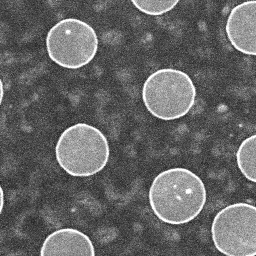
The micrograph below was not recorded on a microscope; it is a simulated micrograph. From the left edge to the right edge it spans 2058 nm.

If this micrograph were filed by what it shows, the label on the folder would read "raised bodies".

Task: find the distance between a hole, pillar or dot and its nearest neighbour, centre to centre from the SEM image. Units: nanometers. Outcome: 825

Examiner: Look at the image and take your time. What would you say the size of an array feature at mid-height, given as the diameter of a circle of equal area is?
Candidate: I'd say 50.7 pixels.